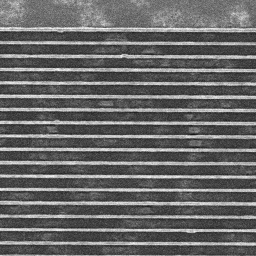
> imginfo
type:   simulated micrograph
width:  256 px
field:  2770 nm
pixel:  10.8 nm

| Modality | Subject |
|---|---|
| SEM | parallel lines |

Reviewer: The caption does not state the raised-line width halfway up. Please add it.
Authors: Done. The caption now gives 29.7 nm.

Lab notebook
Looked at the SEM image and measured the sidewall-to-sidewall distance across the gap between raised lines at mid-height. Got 120 nanometres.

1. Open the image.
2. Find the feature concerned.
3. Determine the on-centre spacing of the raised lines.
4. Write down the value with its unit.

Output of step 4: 0.144 um